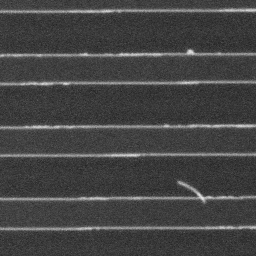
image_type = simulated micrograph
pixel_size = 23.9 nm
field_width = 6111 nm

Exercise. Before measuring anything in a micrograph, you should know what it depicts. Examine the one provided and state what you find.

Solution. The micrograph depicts lines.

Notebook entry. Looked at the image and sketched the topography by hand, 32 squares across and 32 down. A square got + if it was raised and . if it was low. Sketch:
++++++++++++++++++++++++++++++++
................................
................................
................................
................................
................................
................................
++++++++++++++++++++++++++++++++
++++++++++++++++++++++++++++++++
++++++++++++++++++++++++++++++++
+++++++.+.......................
................................
................................
................................
................................
................................
++++++++++++++++++++++++++++++++
++++++++++++++++++++++++++++++++
++++++++++++++++++++++++++++++++
................................
................................
................................
................................
................................
................................
++++++++++++++++++++++++++++++++
++++++++++++++++++++++++++++++++
++++++++++++++++++++++++++++++++
++++++++++++++++++++++++++++++++
................................
................................
................................